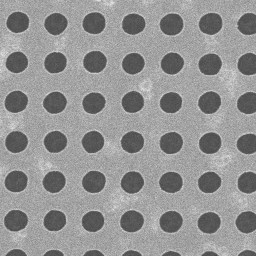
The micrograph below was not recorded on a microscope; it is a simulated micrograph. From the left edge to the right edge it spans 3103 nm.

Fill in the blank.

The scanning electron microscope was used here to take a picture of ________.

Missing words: a regular array of holes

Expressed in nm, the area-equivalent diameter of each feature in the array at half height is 277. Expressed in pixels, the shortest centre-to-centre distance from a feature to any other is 38.3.